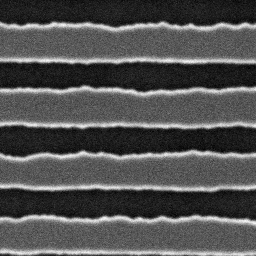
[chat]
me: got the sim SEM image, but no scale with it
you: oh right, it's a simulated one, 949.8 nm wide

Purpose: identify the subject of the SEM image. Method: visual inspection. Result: lines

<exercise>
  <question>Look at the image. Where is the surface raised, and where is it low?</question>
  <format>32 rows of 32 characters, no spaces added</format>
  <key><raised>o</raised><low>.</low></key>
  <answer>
................................
................................
................................
oooooooooooooooooooooooooooooooo
oooooooooooooooooooooooooooooooo
oooooooooooooooooooooooooooooooo
oooooooooooooooooooooooooooooooo
oooooooooooooooooooooooooooooooo
................................
................................
................................
ooooooooooooooooo..ooooooooooooo
oooooooooooooooooooooooooooooooo
oooooooooooooooooooooooooooooooo
oooooooooooooooooooooooooooooooo
oooooooooooooooooooooooooooooooo
................................
................................
................................
o...ooooooooooo.oooooooooooooooo
oooooooooooooooooooooooooooooooo
oooooooooooooooooooooooooooooooo
oooooooooooooooooooooooooooooooo
...ooooooooooooooooooooooooooooo
................................
................................
................................
ooooooooooooooooooooooooooooooo.
oooooooooooooooooooooooooooooooo
oooooooooooooooooooooooooooooooo
oooooooooooooooooooooooooooooooo
oooooooooooooooooooooooooooooooo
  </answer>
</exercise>